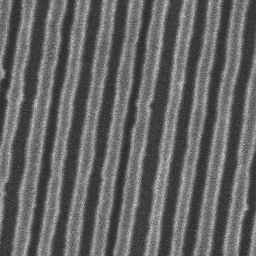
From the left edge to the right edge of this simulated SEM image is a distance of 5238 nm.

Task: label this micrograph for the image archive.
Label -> parallel lines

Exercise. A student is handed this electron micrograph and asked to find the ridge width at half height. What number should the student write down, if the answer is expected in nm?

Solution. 276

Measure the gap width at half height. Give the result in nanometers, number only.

255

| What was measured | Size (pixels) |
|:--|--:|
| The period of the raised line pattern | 26.1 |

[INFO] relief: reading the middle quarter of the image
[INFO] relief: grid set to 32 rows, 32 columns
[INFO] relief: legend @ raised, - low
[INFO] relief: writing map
-@@@---@@@@---@@@---@@@----@@@--
-@@@---@@@@---@@@---@@@----@@@--
-@@@---@@@----@@@---@@@----@@@--
@@@----@@@---@@@@--@@@@----@@@--
@@@----@@@---@@@@--@@@@----@@@--
@@@----@@@---@@@@--@@@@----@@@--
@@@----@@@---@@@@--@@@-----@@@--
@@@---@@@----@@@---@@@-----@@---
@@----@@@----@@@---@@@----@@@---
@@----@@@----@@@--@@@@----@@@---
@@----@@@----@@@--@@@-----@@@---
@@----@@@---@@@@--@@@-----@@----
@@----@@----@@@@--@@@-----@@----
@@----@@----@@@---@@@----@@@----
@@---@@@----@@@---@@@----@@@----
@----@@@----@@@--@@@@----@@@---@
@----@@@----@@@--@@@@----@@@---@
@----@@@---@@@@--@@@@----@@@---@
@----@@@---@@@@--@@@@----@@----@
@---@@@@---@@@---@@@----@@@----@
@---@@@@---@@@---@@@----@@@----@
@---@@@@---@@@--@@@@----@@@----@
----@@@@---@@@--@@@@----@@@----@
----@@@---@@@@--@@@@----@@@---@@
----@@@---@@@@--@@@-----@@----@@
----@@@---@@@---@@@-----@@----@@
----@@@---@@@---@@@----@@@----@@
---@@@---@@@@--@@@@----@@@----@@
---@@@----@@@--@@@@----@@@---@@@
---@@@----@@@--@@@@----@@@---@@@
---@@@---@@@@--@@@@----@@@---@@@
---@@@---@@@@--@@@@----@@----@@@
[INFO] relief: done